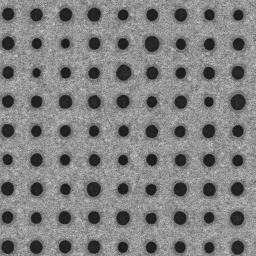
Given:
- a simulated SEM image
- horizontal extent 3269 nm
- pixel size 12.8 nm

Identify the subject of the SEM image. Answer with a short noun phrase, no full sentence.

a regular array of holes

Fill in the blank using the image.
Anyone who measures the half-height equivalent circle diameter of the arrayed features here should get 0.154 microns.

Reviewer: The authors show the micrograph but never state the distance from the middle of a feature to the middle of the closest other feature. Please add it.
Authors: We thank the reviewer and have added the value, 363 nm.